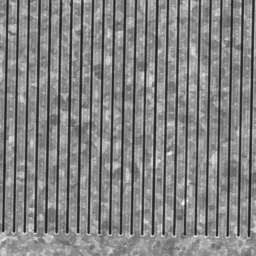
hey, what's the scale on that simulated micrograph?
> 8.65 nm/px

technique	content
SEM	parallel lines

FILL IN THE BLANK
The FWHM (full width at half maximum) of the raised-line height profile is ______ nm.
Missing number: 68.1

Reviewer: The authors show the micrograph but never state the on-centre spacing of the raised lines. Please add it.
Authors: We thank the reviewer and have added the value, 10.7 px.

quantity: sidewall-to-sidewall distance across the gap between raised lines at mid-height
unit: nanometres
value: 25.9